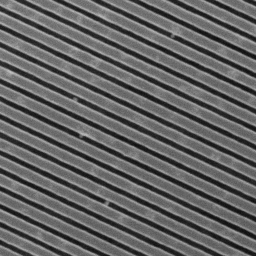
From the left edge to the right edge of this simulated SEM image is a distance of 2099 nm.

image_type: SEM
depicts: parallel lines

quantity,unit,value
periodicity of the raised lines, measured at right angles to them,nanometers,133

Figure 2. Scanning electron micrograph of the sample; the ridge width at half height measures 89 nm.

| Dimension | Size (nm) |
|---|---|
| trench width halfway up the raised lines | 41.7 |